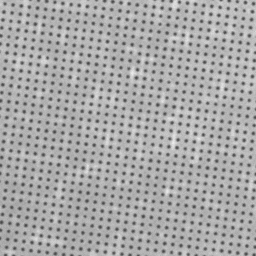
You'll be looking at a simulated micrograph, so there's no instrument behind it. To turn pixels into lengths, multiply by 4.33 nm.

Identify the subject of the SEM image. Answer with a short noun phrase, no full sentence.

a regular array of holes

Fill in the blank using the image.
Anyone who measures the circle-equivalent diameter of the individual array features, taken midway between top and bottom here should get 16.2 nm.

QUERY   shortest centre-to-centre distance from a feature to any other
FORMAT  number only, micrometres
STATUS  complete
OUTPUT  0.0335